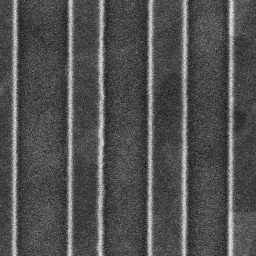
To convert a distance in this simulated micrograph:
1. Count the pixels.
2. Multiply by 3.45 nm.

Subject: one or a few lines or trenches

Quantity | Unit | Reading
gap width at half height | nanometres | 169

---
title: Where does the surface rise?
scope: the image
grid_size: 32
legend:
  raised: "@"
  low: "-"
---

@@-------@@@@------@@@@------@@@
@@-------@@@@------@@@@------@@@
@@-------@@@@------@@@@------@@@
@@-------@@@@------@@@@------@@@
@@-------@@@@------@@@@------@@@
@@-------@@@@------@@@@------@@@
@@-------@@@@------@@@@------@@@
@@-------@@@@------@@@@------@@@
@@-------@@@@------@@@@------@@@
@@-------@@@@------@@@@------@@@
@@-------@@@@------@@@@------@@@
@@-------@@@@------@@@@------@@@
@@-------@@@@------@@@@------@@@
@@-------@@@@------@@@@------@@@
@@-------@@@@------@@@@------@@@
@@-------@@@@------@@@@------@@@
@@-------@@@@------@@@@------@@@
@@-------@@@@------@@@@------@@@
@@-------@@@@------@@@@------@@@
@@-------@@@@------@@@@------@@@
@@-------@@@@------@@@@------@@@
@@-------@@@-------@@@@------@@@
@@-------@@@@------@@@@------@@@
@@-------@@@@------@@@@------@@@
@@-------@@@@------@@@@------@@@
@@-------@@@@------@@@@------@@@
@@-------@@@-------@@@@------@@@
@@-------@@@@------@@@@------@@@
@@-------@@@@------@@@@------@@@
@@-------@@@@------@@@@------@@@
@@-------@@@-------@@@@------@@@
@@-------@@@@------@@@@------@@@